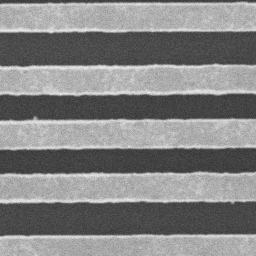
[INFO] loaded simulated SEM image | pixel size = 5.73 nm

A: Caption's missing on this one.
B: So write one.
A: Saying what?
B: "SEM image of lines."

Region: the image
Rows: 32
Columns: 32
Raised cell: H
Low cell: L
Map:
LLLLLLLLLLLLLLLLHHHHHLLLHHHHHHHH
HHHHHHHHHHHHHHHHHHHHHHHHHHHHHHHH
HHHHHHHHHHHHHHHHHHHHHHHHHHHHHHHH
HHHHHHHHHHHHHHHHHHHHHHHHHHHHHHHH
LLLLLLLLLLLLLLLLLLLLLLLLLLLLLLLL
LLLLLLLLLLLLLLLLLLLLLLLLLLLLLLLL
LLLLLLLLLLLLLLLLLLLLLLLLLLLLLLLL
LLLLLLLLLLLLLLLLLLLLLLLLLLLLLLLL
HHHHHHHHHHHHHHHHHHHHHHHHHHHHHHHH
HHHHHHHHHHHHHHHHHHHHHHHHHHHHHHHH
HHHHHHHHHHHHHHHHHHHHHHHHHHHHHHHH
HHHHHHHHHHHHHHHHHHHHHHHHHHHHHLLH
LLLLLLLLLLLLLLLLLLLLLLLLLLLLLLLL
LLLLLLLLLLLLLLLLLLLLLLLLLLLLLLLL
LLLLLLLLLLLLLLLLLLLLLLLLLLLLLLLL
HHHHHHHHHHHHHHHHHHHHHHHHHHHHHHHH
HHHHHHHHHHHHHHHHHHHHHHHHHHHHHHHH
HHHHHHHHHHHHHHHHHHHHHHHHHHHHHHHH
HHHHHHHHHHHLLLLHHHLHHHLLLHHHLLLL
LLLLLLLLLLLLLLLLLLLLLLLLLLLLLLLL
LLLLLLLLLLLLLLLLLLLLLLLLLLLLLLLL
LLLLLLLLLLLLLLLLLLLLLLLLLLLLLLLL
HHHHHHHHHHHHHHHHHHHHHHHHHHHHHHHH
HHHHHHHHHHHHHHHHHHHHHHHHHHHHHHHH
HHHHHHHHHHHHHHHHHHHHHHHHHHHHHHHH
LLLLLLLLLLLLLLLLLLLLLLLLLLLLLLLL
LLLLLLLLLLLLLLLLLLLLLLLLLLLLLLLL
LLLLLLLLLLLLLLLLLLLLLLLLLLLLLLLL
LLLLLLLLLLLLLLLLLLLLLLLLLLLLLLLL
LLLLLLLLLLLLLLLLLLLLLLLLLLLLHLHH
HHHHHHHHHHHHHHHHHHHHHHHHHHHHHHHH
HHHHHHHHHHHHHHHHHHHHHHHHHHHHHHHH